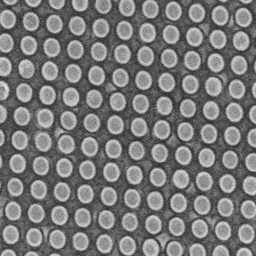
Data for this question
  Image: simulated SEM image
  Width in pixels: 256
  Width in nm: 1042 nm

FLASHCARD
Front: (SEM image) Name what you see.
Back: a regular array of raised bodies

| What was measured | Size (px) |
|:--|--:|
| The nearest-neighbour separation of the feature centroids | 23.3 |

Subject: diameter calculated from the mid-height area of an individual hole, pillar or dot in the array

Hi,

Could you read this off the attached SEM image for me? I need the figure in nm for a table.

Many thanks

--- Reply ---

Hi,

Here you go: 63.4